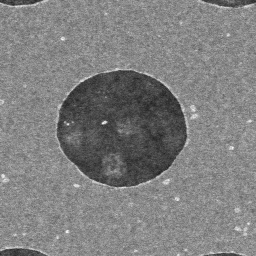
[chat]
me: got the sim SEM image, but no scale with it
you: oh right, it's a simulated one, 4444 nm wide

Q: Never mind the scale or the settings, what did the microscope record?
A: holes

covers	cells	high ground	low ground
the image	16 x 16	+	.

++++++++++++++++
++++++++++++++++
++++++++++++++++
++++++++++++++++
+++++++..+++++++
+++++.....++++++
++++.......+++++
++++........++++
++++........++++
++++.......+++++
+++++......+++++
++++++...+++++++
++++++++++++++++
++++++++++++++++
++++++++++++++++
++++++++++++++++